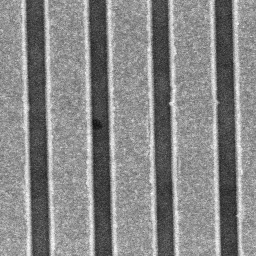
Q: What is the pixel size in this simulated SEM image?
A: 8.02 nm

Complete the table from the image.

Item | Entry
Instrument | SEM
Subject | one or a few lines or trenches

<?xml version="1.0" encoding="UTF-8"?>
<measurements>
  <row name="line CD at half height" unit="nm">323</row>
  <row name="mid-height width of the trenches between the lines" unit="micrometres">0.181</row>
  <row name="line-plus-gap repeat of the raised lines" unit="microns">0.502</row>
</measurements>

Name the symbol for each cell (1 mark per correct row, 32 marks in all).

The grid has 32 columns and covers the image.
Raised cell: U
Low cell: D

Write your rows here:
UUUDDDUUUUUDDDUUUUUDDUUUUUDDDUUU
UUUDDDUUUUUDDDUUUUUDDUUUUUUDDUUU
UUUDDDUUUUUDDDUUUUUDDUUUUUUDDUUU
UUUDDDUUUUUDDDUUUUUDDDUUUUUDDDUU
UUUDDDUUUUUDDDUUUUUDDUUUUUUDDDUU
UUUDDDUUUUUDDDUUUUUDDUUUUUUDDDUU
UUUDDDUUUUUDDDUUUUUDDDUUUUUDDUUU
UUUDDDUUUUUDDDUUUUUDDDUUUUUDDUUU
UUUDDDUUUUUDDDUUUUUDDDUUUUUDDDUU
UUUDDDUUUUUDDDUUUUUDDDUUUUUDDDUU
UUUDDDUUUUUDDDUUUUUDDDUUUUUDDDUU
UUUDDDUUUUUDDDUUUUUDDDUUUUUDDDUU
UUUDDDUUUUUDDDUUUUUDDDUUUUUDDDUU
UUUDDDUUUUUDDDUUUUUDDDUUUUUDDDUU
UUUDDDUUUUUDDDUUUUUDDDUUUUUDDDUU
UUUDDDUUUUUDDDUUUUUDDDUUUUUDDDUU
UUUDDDUUUUUDDDUUUUUDDDUUUUUDDDUU
UUUDDDUUUUUDDDUUUUUDDDUUUUUDDDUU
UUUDDDUUUUUDDDUUUUUDDDUUUUUDDDUU
UUUDDDUUUUUDDDUUUUUDDDUUUUUDDDUU
UUUDDDUUUUUDDDUUUUUDDDUUUUUDDDUU
UUUDDDUUUUUDDDUUUUUDDDUUUUUDDDUU
UUUDDDUUUUUDDDUUUUUDDDUUUUUDDDUU
UUUDDDUUUUUDDDUUUUUDDDUUUUUDDDUU
UUUDDDUUUUUDDDUUUUUDDDUUUUUDDDUU
UUUDDDDUUUUDDDUUUUUDDDUUUUUDDDUU
UUUUDDUUUUUDDDUUUUUDDDUUUUUDDDUU
UUUUDDUUUUUDDDUUUUUDDDUUUUUDDDUU
UUUUDDUUUUUUDDUUUUUDDDUUUUUDDDUU
UUUUDDDUUUUDDDUUUUUDDDUUUUUDDDUU
UUUUDDDUUUUDDDUUUUUDDDUUUUUDDDUU
UUUUDDDUUUUDDDUUUUUDDDUUUUUDDDUU